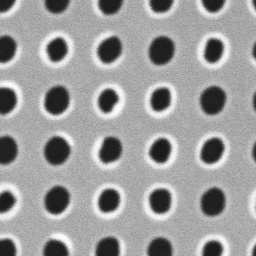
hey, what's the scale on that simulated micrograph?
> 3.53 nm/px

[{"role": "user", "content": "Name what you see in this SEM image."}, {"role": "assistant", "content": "a regular array of holes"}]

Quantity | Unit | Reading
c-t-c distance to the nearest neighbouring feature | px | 49.9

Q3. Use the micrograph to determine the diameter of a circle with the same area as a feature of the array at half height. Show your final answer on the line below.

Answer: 87.1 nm